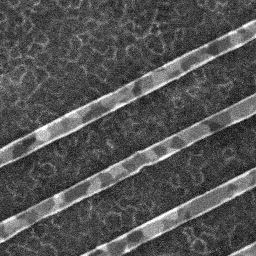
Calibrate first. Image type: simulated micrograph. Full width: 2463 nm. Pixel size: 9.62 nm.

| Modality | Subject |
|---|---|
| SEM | one or a few lines or trenches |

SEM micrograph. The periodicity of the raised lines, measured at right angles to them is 635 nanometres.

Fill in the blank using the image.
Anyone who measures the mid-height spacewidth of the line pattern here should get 0.483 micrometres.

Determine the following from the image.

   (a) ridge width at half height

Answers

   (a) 149 nm